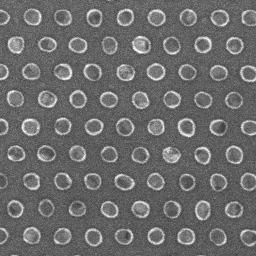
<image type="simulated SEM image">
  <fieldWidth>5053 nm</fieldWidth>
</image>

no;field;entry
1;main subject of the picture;a regular array of raised bodies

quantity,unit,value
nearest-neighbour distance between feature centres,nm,605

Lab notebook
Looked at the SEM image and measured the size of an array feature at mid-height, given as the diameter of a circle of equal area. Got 310 nm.